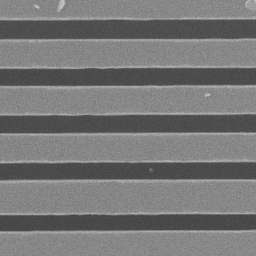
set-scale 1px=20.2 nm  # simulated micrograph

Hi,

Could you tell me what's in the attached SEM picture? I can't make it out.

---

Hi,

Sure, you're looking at lines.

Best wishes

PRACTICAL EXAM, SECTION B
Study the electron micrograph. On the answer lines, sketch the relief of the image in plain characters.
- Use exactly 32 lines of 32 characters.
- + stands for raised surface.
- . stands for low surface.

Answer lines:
++++++++++++++++++++++++++++++++
++++++++++++++++++++++++++++++++
................................
................................
................................
++++++++++++++++++++++++++++++++
++++++++++++++++++++++++++++++++
++++++++++++++++++++++++++++++++
+++++++++++.+++.................
................................
................................
++++++++++++++++++++++++++++++++
++++++++++++++++++++++++++++++++
++++++++++++++++++++++++++++++++
................................
................................
................................
++++++++++++++++++++++++++++++++
++++++++++++++++++++++++++++++++
++++++++++++++++++++++++++++++++
................................
................................
.+++++++++++++++++++++++++++++++
++++++++++++++++++++++++++++++++
++++++++++++++++++++++++++++++++
++++++++++++++++++++++++++++++++
++++++++++++++++++++++++++++++++
................................
................................
++++++++++++++++++++++++++++++++
++++++++++++++++++++++++++++++++
++++++++++++++++++++++++++++++++